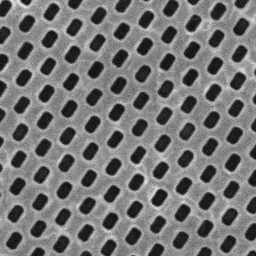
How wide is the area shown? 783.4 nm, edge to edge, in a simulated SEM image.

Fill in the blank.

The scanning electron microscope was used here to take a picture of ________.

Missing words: a regular array of holes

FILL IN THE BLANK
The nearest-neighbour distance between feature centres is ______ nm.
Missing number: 82.5